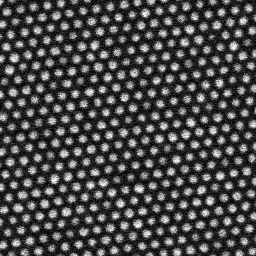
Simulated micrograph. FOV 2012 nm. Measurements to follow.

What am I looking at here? a regular array of raised bodies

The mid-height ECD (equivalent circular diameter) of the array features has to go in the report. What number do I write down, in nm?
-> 56.1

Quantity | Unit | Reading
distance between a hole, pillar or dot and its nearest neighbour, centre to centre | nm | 102